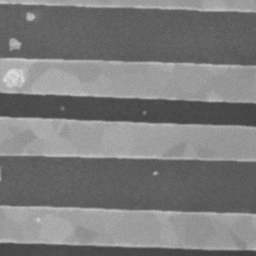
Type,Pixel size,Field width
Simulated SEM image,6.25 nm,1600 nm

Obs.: lines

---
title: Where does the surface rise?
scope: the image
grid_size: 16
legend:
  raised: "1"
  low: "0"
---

0000000000111111
0000000000000000
0000000000000000
0000000000000000
1111111111111111
1111111111111111
0000000000000000
1111000000000000
1111111111111111
1111111111111111
0000000000000000
0000000000000000
0000000000000000
1111111111111111
1111111111111111
0000000000011111